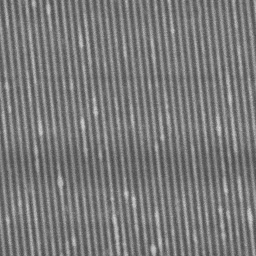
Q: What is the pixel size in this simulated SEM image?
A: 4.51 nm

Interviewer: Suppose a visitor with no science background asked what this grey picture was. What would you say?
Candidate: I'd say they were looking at parallel lines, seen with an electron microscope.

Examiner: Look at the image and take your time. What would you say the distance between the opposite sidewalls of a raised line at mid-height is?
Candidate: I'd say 9.5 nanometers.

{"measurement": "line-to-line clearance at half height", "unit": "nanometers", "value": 21.8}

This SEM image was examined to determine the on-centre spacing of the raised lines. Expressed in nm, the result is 32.